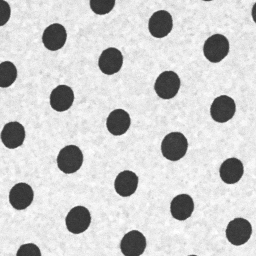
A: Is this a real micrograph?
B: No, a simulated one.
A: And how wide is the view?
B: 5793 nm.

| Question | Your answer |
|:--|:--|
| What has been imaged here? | a regular array of holes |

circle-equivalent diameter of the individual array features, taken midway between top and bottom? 602 nanometres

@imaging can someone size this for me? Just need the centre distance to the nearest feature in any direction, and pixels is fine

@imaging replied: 60.9